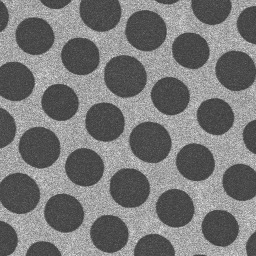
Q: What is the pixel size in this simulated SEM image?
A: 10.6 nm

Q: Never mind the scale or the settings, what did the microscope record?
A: a regular array of holes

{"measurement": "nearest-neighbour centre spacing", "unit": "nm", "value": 521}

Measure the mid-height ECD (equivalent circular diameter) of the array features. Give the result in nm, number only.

406